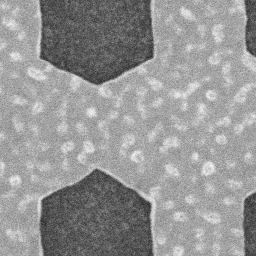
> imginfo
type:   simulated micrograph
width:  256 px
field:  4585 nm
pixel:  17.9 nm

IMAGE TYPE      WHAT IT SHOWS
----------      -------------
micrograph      holes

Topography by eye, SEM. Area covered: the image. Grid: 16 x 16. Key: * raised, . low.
**........*****.
***.......*****.
***.......*****.
***.......******
****....********
****************
****************
****************
****************
****************
****************
*****...********
***......******.
***......******.
**.......******.
***.......*****.